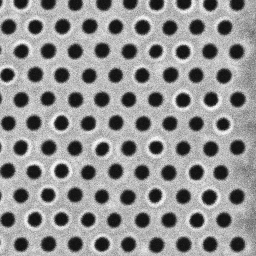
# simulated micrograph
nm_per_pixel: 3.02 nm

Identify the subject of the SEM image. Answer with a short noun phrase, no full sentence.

a regular array of holes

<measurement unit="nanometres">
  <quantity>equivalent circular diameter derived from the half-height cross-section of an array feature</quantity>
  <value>44.5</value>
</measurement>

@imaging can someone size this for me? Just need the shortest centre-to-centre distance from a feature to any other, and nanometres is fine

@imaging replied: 80.2